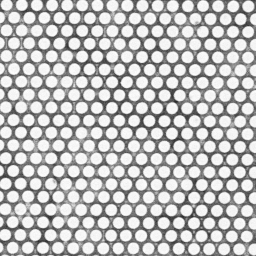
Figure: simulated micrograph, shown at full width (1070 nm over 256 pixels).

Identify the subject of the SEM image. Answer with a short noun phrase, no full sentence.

a regular array of raised bodies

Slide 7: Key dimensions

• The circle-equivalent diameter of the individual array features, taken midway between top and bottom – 48.1 nm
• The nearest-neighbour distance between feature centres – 60.9 nm